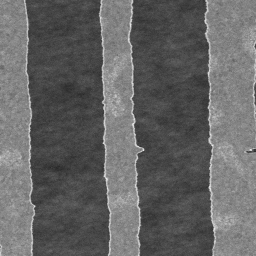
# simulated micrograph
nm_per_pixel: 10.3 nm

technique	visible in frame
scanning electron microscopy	one or a few lines or trenches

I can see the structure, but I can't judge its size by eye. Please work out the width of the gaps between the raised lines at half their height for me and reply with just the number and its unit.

771 nanometers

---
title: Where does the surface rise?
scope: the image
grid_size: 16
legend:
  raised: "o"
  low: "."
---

oo....oo.....ooo
oo....oo.....ooo
oo....oo.....ooo
oo....oo.....ooo
oo....oo.....ooo
oo....oo.....ooo
oo.....o.....ooo
oo.....o.....ooo
oo.....o.....ooo
oo.....oo....ooo
oo.....oo....ooo
oo.....oo....ooo
oo.....oo....ooo
oo.....oo....ooo
oo.....oo....ooo
oo.....oo....ooo